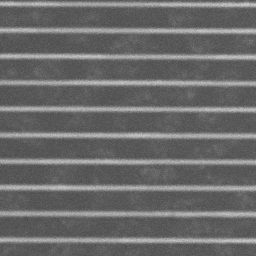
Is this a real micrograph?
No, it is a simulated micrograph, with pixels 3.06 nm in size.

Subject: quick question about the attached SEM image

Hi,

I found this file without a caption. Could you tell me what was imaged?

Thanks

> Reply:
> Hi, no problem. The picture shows parallel lines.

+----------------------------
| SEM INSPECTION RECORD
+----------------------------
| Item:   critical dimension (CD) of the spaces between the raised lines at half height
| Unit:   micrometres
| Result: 0.0689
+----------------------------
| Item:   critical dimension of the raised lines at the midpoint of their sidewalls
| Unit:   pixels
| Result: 3.5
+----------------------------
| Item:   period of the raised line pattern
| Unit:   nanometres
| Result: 80.3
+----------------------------